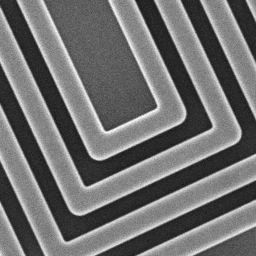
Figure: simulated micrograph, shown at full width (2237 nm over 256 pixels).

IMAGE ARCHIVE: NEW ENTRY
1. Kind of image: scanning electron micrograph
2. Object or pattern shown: groups of lines, slits or small figures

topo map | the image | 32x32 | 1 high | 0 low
00111100000000111000111001110001
00011100000000111000111000111001
10011100000000011100111100111000
10001110000000011100011100011100
11001110000000001110011110011100
11000111000000001110001110001110
11100111000000000111001111001110
11100011100000000111000111000111
11110011100000000011100111000111
01110001110000000011100011100011
01111001110000000001110011100011
00111000111000000001110001110011
00111000111000000001111001110001
00011100111100000000111000111001
10011100011100000011111000111000
10001110011110001111110000011100
11001110001111111111000000111100
11000111001111111100000011111100
11100111000111110000011111110000
11100111100111000001111111000001
11100011100000000111111100000111
01110011110000011111110000011111
01110001110001111111000001111111
00111001111111111100000111111100
00111000111111100000011111110000
00011100111110000001111111000001
10011100011000001111111000000111
10001110000000111111100000011111
11001110000011111110000001111110
11001111001111111000001111111000
11000111111111100000111111100000
11100111111110000011111110000000